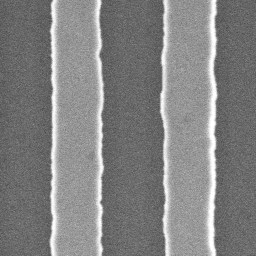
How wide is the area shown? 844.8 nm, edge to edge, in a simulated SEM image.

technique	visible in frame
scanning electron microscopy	lines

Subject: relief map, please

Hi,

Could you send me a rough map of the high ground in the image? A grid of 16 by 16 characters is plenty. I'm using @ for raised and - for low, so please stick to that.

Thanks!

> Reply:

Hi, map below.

---@@@----@@@---
---@@@----@@@---
---@@@----@@@---
---@@@----@@@---
---@@@----@@@---
---@@@----@@@---
---@@@----@@@---
---@@@----@@@---
---@@@----@@@---
---@@@----@@@---
---@@@----@@@---
---@@@----@@@---
---@@@----@@@---
---@@@----@@@---
---@@@----@@@---
---@@@----@@@---